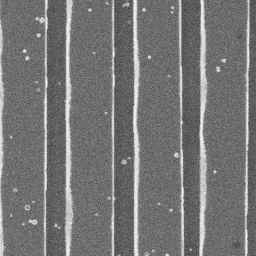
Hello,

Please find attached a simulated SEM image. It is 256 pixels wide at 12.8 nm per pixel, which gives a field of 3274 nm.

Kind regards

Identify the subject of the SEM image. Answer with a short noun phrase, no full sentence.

lines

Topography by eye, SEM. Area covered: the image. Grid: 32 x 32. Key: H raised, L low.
HHHHHHLLLHHHHHLLLHHHHHHLLHHHHHHL
HHHHHHLLLHHHHHLLLHHHHHHLLHHHHHHL
HHHHHHLLLHHHHHLLLHHHHHHLLHHHHHHL
HHHHHHLLLHHHHHLLLHHHHHHLLHHHHHHL
HHHHHHLLLHHHHHLLLHHHHHHLLHHHHHHL
HHHHHHLLHHHHHHLLLHHHHHHLLHHHHHHL
HHHHHHLLHHHHHHLLLHHHHHHLLHHHHHHL
HHHHHHLLHHHHHHLLLHHHHHHLLHHHHHHL
HHHHHHLLHHHHHHLLLHHHHHHLLHHHHHHL
HHHHHHLLHHHHHHLLLHHHHHHLLHHHHHHL
HHHHHHLLLHHHHHLLLHHHHHHLLHHHHHHL
HHHHHHLLLHHHHHLLLHHHHHHLLHHHHHHL
HHHHHHLLHHHHHHLLLHHHHHHLLHHHHHHL
HHHHHHLLHHHHHHLLLHHHHHHLLHHHHHHL
HHHHHHLLHHHHHHLLLHHHHHHLLHHHHHHL
HHHHHHLLHHHHHHLLLHHHHHHLLHHHHHHL
HHHHHHLLHHHHHHLLLHHHHHHLLHHHHHHL
HHHHHHLLLHHHHHLLLHHHHHHLLHHHHHHL
HHHHHHLLLHHHHHLLLHHHHHHLLHHHHHHL
HHHHHHLLLHHHHHLLLHHHHHHLLHHHHHHL
HHHHHHLLLHHHHHLLLHHHHHHLLHHHHHHL
HHHHHHLLLHHHHHLLLHHHHHHLLHHHHHHL
HHHHHHLLHHHHHHLLLHHHHHHLLHHHHHHL
HHHHHHLLHHHHHHLLLHHHHHHLLHHHHHHL
HHHHHHLLLHHHHHLLLHHHHHHLLHHHHHHL
HHHHHHLLLHHHHHLLLHHHHHHLLHHHHHHL
HHHHHHLLLHHHHHLLLHHHHHHLLHHHHHHL
HHHHHHLLLHHHHHLLLHHHHHHLLHHHHHHL
HHHHHHLLLHHHHHLLLHHHHHHLLHHHHHHL
HHHHHHLLLHHHHHLLLHHHHHHLLHHHHHHL
HHHHHHLLHHHHHHLLLHHHHHHLLHHHHHHL
HHHHHHLLHHHHHHLLLHHHHHHLLHHHHHHL